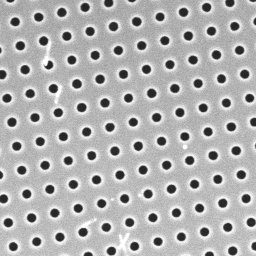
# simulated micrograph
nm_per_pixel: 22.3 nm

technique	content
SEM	a regular array of holes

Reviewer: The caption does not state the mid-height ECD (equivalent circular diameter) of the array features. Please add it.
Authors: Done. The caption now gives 220 nm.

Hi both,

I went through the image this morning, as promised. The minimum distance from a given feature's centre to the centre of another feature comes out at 527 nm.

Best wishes